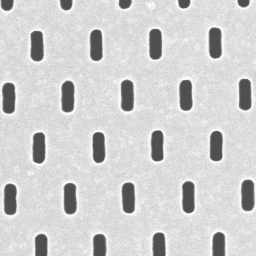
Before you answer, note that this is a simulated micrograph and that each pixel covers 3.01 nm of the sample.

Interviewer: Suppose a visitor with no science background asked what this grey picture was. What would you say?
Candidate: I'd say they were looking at a regular array of holes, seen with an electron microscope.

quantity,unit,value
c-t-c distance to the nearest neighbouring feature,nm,176